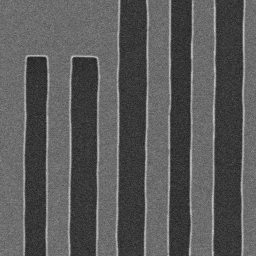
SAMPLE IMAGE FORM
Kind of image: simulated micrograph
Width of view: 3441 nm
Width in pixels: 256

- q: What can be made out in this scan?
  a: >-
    groups of lines, slits or small figures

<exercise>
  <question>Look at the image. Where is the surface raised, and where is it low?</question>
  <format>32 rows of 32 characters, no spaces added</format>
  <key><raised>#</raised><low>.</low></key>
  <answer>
###############...###...###....#
###############....##...###...##
###############....##...###...##
###############....##...###...##
###############....##...###...##
###############...###...###...##
###############...###...###...##
###...###...###...###...###...##
###...###...###....##...###...##
###...###...###....##...###...##
###...###...###....##...###...##
###...###...###...###...###...##
###...###...###...###...###...##
###...###...###...###...###...##
###...###...###...###...###...##
###...###...###...###...###...##
###...###...###...###...###...##
###...###...###...###...###...##
###...###...###...###...###...##
###...###...###...###...###...##
###...###...###...###...###...##
###...###...###...###...###...##
###...###...###...###...###...##
###...###...###...###...###...##
###...###...###...###...###...##
###...###...###...###...###...##
###...###...###...###...###...##
###...###...###...###...###...##
###...###...###...###...###...##
###...###...###...###...###...##
###...###...###...###...###...##
###...###...###...###...###...##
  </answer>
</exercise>